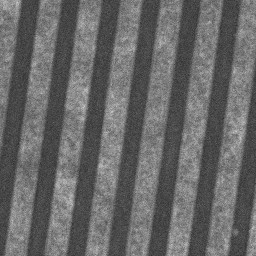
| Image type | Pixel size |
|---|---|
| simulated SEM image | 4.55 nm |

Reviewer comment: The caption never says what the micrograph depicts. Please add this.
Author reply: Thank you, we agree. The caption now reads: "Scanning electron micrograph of parallel lines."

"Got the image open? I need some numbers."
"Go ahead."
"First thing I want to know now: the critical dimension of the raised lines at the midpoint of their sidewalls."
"0.0895 um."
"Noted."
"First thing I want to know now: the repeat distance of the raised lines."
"182 nm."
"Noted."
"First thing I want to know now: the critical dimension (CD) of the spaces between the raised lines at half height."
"19.7 pixels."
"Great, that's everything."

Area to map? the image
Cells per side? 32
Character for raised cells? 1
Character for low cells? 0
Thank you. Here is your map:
11100110001110011100111001110011
11000110001100011100111001110011
11000110001100011000110001100011
11000110001100011000110001100011
11001110001100011000110001100011
11001110011100111001110001100111
11001110011100111001110011100111
11001110011100111001110011100111
10001100011000111001110011100111
10001100011000110001100011000111
10001100011000110001100011000110
10011100011000110001100011000110
10011100111000110011100011000110
10011100111001110011100111001110
10011100111001110011100111001110
00011000110001110011100111001110
00011000110001100011100110001110
00011000110001100011000110001100
00011000110001100011000110001100
00111001110001100011000110001100
00111001110011100111001110011100
00111001110011100111001110011100
00111001110011100111001110011100
00110001100011000111001110011100
00110001100011000110001100011000
00110001100011000110001100011000
01110011100111000110001100011000
01110011100111001110011100111000
01110011100111001110011100111001
01100011100111001110011100111001
01100011000110001100011100111001
01100011000110001100011000110001